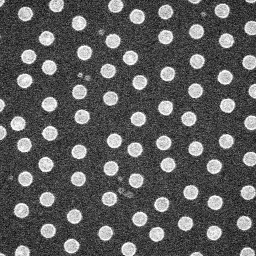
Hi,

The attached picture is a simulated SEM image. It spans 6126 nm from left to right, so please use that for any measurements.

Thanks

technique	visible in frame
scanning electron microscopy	a regular array of raised bodies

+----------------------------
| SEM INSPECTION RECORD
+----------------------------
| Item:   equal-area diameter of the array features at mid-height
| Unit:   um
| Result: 0.321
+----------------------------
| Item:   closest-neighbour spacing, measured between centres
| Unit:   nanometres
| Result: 652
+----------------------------